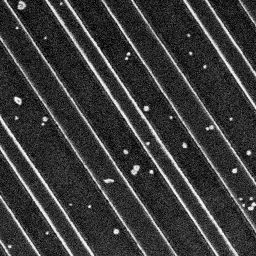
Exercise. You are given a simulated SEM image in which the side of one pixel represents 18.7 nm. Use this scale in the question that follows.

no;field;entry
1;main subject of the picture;lines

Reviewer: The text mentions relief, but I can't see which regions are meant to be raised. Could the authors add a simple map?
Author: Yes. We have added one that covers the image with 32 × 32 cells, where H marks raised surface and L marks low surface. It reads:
HLLLLLHHHLLLLHHHHLLLLLLHHHLLLLHH
HHLLLLLHHLLLLLHHHHLLLLLLHHHLLLLH
HHLLLLLHHHLLLLHHHHLLLLLLLHHLLLLH
HHHLLLLLHHHLLLLHHHHLLLLLLHHHLLLL
HHHHLLLLLHHLLLLLHHHHLLLLLLHHHLLL
HHHHLLLLLHHHLLLLHHHHLLLLLLLHHLLL
LHHHHLLLLLHHHLLLLHHHHLLLLLLHHHLL
LLHHHHLLLLLHHLLLLLHHHHLLLLLLHHHL
LLHHHHLLLLLHHHLLLLHHHHLLLLLLLHHL
LLLHHHHLLLLLHHHLLLLHHHHLLLLLLHHH
LLLLHHHHLLLLLHHLLLLLHHHHLLLLLLHH
LLLLHHHHLLLLLHHHLLLLHHHHLLLLLLLH
LLLLLHHHHLLLLLHHHLLLLHHHHLLLLLLH
LLLLLLHHHHLLLLLHHLLLLLHHHHLLLLLL
LLLLLLHHHHLLLLLHHHLLLLHHHHLLLLLL
HLLLLLLHHHHLLLLLHHHLLLLHHHHLLLLL
HLLLLLLLHHHHLLLLLHHLLLLLHHHHLLLL
HHLLLLLLHHHHLLLLLHHHLLLLHHHHLLLL
HHHLLLLLLHHHHLLLLLHHHLLLLHHHHLLL
LHHLLLLLLLHHHHLLLLLHHLLLLLHHHHLL
LHHHLLLLLLHHHHLLLLLHHHLLLLHHHHLL
LLHHHLLLLLLHHHHLLLLLHHHLLLLHHHHL
LLLHHLLLLLLLHHHHLLLLLHHLLLLLHHHH
LLLHHHLLLLLLHHHHLLLLLHHHLLLLHHHH
LLLLHHHLLLLLLHHHHLLLLLHHHLLLLHHH
HLLLLHHLLLLLLLHHHHLLLLLHHLLLLLHH
HLLLLHHHLLLLLLHHHHLLLLLHHHLLLLHH
HHLLLLHHHLLLLLLHHHHLLLLLHHHLLLLH
HHHLLLLHHLLLLLLLHHHHLLLLLHHLLLLL
HHHLLLLHHHLLLLLLLHHHLLLLLHHHLLLL
HHHHLLLLHHHLLLLLLHHHHLLLLLHHHLLL
LHHHHLLLLHHLLLLLLLHHHHLLLLLHHLLL